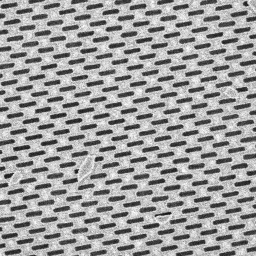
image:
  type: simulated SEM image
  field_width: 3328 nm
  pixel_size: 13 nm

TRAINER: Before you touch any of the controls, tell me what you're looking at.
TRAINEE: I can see a regular array of holes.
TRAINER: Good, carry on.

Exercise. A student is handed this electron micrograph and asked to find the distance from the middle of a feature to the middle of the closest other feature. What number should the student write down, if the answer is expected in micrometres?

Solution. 0.21